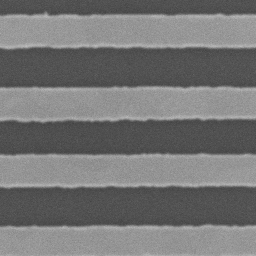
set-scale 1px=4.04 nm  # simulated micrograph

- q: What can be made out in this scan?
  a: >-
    lines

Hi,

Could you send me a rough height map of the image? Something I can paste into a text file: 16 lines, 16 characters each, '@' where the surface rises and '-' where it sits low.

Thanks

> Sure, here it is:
----------------
@@@@@@@@@@@@@@@@
@@@@@@@@@@@@@@@@
----------------
----------------
-------@@@@-@@@-
@@@@@@@@@@@@@@@@
@@@@-@@---------
----------------
----------------
@@@@@@@@@@@@@@@@
@@@@@@@@@@@@@@@@
----------------
----------------
@@@@@@@@@@@@@@@@
@@@@@@@@@@@@@@@@